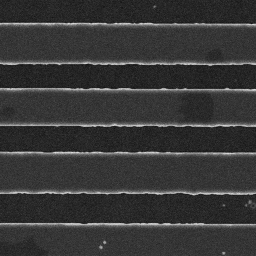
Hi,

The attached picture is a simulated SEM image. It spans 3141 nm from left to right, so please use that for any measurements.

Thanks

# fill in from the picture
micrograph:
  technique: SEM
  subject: lines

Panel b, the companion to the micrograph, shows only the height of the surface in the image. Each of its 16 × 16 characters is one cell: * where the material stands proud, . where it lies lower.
................
**********..*...
****************
****************
................
................
****************
****************
................
................
****************
****************
................
................
****************
****************